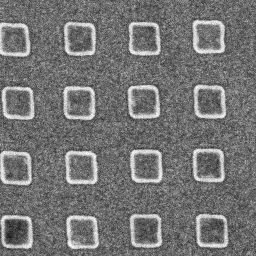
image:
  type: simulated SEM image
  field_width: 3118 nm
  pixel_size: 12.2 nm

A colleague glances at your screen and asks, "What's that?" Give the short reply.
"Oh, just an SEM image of a regular array of raised bodies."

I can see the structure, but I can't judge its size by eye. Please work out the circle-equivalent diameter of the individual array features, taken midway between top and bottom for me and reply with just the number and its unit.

0.397 microns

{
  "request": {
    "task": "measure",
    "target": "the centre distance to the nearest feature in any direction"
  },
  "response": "772 nm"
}